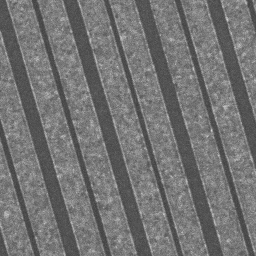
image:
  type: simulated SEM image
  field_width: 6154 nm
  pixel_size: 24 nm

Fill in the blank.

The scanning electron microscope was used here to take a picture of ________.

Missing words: parallel lines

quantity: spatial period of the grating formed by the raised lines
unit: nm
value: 824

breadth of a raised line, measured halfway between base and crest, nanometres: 557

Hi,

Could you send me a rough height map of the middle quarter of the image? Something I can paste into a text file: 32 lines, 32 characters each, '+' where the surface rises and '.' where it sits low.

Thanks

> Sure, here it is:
++++.....+++++..++++++....++++++
+++++....++++++..+++++....++++++
+++++....++++++..++++++....+++++
+++++....++++++..++++++....+++++
+++++.....+++++...+++++.....++++
++++++....++++++..++++++....++++
++++++....++++++..++++++....++++
++++++.....+++++..++++++....++++
.++++++....++++++..++++++....+++
.++++++....++++++..++++++....+++
.++++++....++++++..++++++....+++
.++++++.....+++++..++++++.....++
..++++++....++++++..++++++....++
..++++++....++++++..++++++....++
..++++++.....+++++..++++++....++
+..++++++....++++++..++++++....+
+..++++++....++++++..++++++....+
+..++++++....++++++..++++++....+
++..++++++....++++++.++++++.....
++..++++++....++++++..++++++....
++..++++++....++++++..++++++....
+++.++++++.....+++++..++++++....
+++..++++++....++++++..++++++...
+++..++++++....++++++..++++++...
+++..++++++....++++++..++++++...
++++..++++++....++++++.++++++...
++++..++++++....++++++..++++++..
++++..++++++....++++++..++++++..
+++++.++++++.....++++++..+++++..
+++++..++++++....++++++..++++++.
+++++..++++++....++++++..++++++.
+++++..++++++.....+++++..++++++.